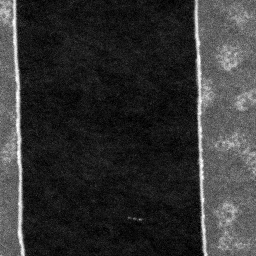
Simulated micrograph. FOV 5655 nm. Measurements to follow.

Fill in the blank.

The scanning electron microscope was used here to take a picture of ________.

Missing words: one or a few lines or trenches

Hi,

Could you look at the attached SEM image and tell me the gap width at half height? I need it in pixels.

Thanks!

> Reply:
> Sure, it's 182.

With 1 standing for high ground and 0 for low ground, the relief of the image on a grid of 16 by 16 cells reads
1000000000001111
1000000000001111
1000000000001111
1000000000001111
1000000000001111
1000000000001111
1000000000001111
1000000000001111
1000000000000111
1000000000000111
1000000000000111
1000000000000111
1000000000000111
1000000000000111
1000000000000111
1000000000000111